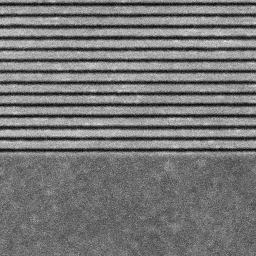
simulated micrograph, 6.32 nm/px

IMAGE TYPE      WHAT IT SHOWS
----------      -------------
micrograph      parallel lines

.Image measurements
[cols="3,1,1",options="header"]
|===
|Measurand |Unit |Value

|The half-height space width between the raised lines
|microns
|0.0253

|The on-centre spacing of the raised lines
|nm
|71.1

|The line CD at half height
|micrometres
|0.0451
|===